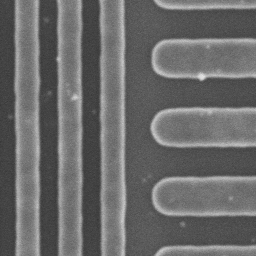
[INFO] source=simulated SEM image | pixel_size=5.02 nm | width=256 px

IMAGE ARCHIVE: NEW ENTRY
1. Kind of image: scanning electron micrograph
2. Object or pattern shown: groups of lines, slits or small figures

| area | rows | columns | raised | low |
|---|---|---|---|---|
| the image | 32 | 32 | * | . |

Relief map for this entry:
..***..***...**.....************
..***..***...**.................
..***..***...**.................
..***..***...**.................
..***..***...**.................
..***..***...**.....************
..***..***...**....*************
..***..***...**....*************
..***..***...**....*************
..***..***...**......***********
..***..***...**.................
..***..***...**.................
..***..***...**.................
..***..***...**.................
..***..***...**.....************
..***..***...**....*************
..***..***...**....*************
..***..***...**.....************
..***..***...**.................
..***..***...**.................
..***..***...**.................
..***..***...**.................
..***..***...**.....************
..***..***...***...*************
..***..***...***...*************
..***..***...***...*************
..***..***...***....************
..***..***...**.................
..***...**...**.................
..***..***...**.................
..***..***...**.................
..***..***...**.....************